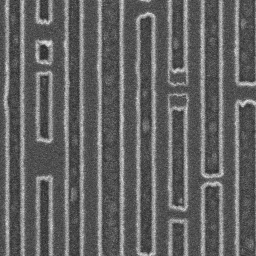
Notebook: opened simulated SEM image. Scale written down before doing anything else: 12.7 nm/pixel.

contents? parallel lines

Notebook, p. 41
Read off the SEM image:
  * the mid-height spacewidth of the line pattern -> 182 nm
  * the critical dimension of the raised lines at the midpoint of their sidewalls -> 226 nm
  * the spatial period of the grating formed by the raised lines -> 419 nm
